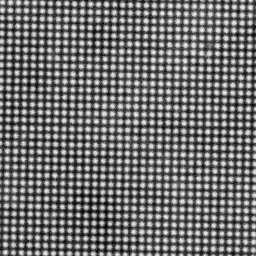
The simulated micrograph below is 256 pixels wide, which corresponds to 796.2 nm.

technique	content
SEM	a regular array of raised bodies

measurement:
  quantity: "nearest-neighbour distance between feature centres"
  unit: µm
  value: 0.0233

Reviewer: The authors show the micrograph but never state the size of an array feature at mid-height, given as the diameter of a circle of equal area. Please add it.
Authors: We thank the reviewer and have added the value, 15.3 nanometers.